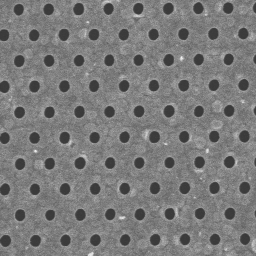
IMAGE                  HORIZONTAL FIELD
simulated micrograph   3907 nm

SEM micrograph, a regular array of holes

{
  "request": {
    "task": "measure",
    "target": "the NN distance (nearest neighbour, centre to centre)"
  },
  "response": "29.5 px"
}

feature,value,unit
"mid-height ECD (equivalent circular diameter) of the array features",0.17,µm